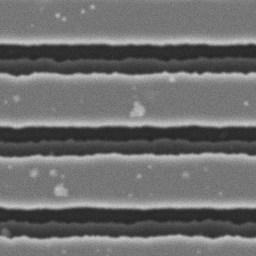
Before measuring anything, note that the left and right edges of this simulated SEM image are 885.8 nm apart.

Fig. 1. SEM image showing lines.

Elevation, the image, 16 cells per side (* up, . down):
****************
****************
****************
................
................
****************
****************
****************
................
................
****************
****************
****************
................
................
****************